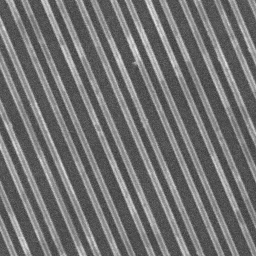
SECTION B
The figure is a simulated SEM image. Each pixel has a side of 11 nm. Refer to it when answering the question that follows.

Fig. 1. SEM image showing parallel lines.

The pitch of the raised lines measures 174 nm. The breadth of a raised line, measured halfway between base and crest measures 0.0519 µm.